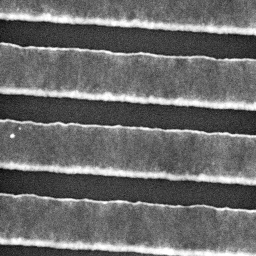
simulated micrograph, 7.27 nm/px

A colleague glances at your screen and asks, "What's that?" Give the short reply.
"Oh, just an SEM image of lines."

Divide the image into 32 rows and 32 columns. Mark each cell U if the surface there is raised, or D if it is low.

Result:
UUUUUUUUUUUUUUUUUUUUUUUUUUUUUUUU
UUUUUUUUUUUUUUUUUUUUUUUUUUUUUUUU
DDDDDDUUUUUUUUUUUUUUUUUUUUUUUUUU
DDDDDDDDDDDDDDDDDDDDUUUUUUUUUUUU
DDDDDDDDDDDDDDDDDDDDDDDDDDDDDDDD
UUDDDDDDDDDDDDDDDDDDDDDDDDDDDDDD
UUUUUUUUUUUUUUDDDDDDDDDDDDDDDDDD
UUUUUUUUUUUUUUUUUUUUUUUUUUUUUUUU
UUUUUUUUUUUUUUUUUUUUUUUUUUUUUUUU
UUUUUUUUUUUUUUUUUUUUUUUUUUUUUUUU
UUUUUUUUUUUUUUUUUUUUUUUUUUUUUUUU
UUUUUUUUUUUUUUUUUUUUUUUUUUUUUUUU
DDDDDDDDDDDDDDUUUUUUUUUUUUUUUUUU
DDDDDDDDDDDDDDDDDDDDDDDDDDDUUUUU
DDDDDDDDDDDDDDDDDDDDDDDDDDDDDDDD
UUUUUUUUDUDDDDDDDDDDDDDDDDDDDDDD
UUUUUUUUUUUUUUUUUUUUUUUUUDDDDDDD
UUUUUUUUUUUUUUUUUUUUUUUUUUUUUUUU
UUUUUUUUUUUUUUUUUUUUUUUUUUUUUUUU
UUUUUUUUUUUUUUUUUUUUUUUUUUUUUUUU
UUUUUUUUUUUUUUUUUUUUUUUUUUUUUUUU
DDDDDDDDUUUUUUUUUUUUUUUUUUUUUUUU
DDDDDDDDDDDDDDDDDDDDDDDDUUUUUUUU
DDDDDDDDDDDDDDDDDDDDDDDDDDDDDDDD
UUUUUDDDDDDDDDDDDDDDDDDDDDDDDDDD
UUUUUUUUUUUUUUUUUUUDDDDDDDDDDDDD
UUUUUUUUUUUUUUUUUUUUUUUUUUUUUUUU
UUUUUUUUUUUUUUUUUUUUUUUUUUUUUUUU
UUUUUUUUUUUUUUUUUUUUUUUUUUUUUUUU
UUUUUUUUUUUUUUUUUUUUUUUUUUUUUUUU
DUUUUUUUUUUUUUUUUUUUUUUUUUUUUUUU
DDDDDDDDDDDDDDDDDDDUUUUUUUUUUUUU